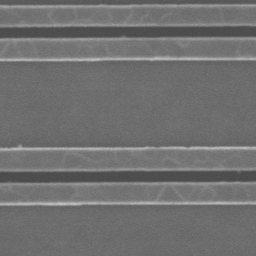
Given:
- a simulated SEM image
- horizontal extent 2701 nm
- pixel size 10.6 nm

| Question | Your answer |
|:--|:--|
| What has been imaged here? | lines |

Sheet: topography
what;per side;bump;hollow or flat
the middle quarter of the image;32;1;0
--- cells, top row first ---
00000000000000000000000000000000
00000000000000000000000000000000
00000000000000000000000000000000
00000000000000000000000000000000
00000000000000000000000000000000
00000000000000000000000000000000
00000000000000000000000000000000
00000000000000000000000000000000
00000000000000000000000000000000
00000000000000000000000000000000
00000000000000000000000000000000
00000000000000000000000000000000
00000000000000000000000000000000
00000000000000000000000000000000
00000000000000000000000000000000
00000000000000000000000000000000
00000000000000000000000000000000
00000000000000000000000000000000
00000000000000000000000000000000
00000000000000000000000000000000
00000000000000000000000000000000
11111111111111111111111111111111
11111111111111111111111111111111
11111111111111111111111111111111
11111111111111111111111111111111
11111111111111111111111111111111
11111111111111111111111111111111
00000000000000000000000000000000
00000000000000000000000000000000
00000000000000000000000000000000
11111111111111111111111111111111
11111111111111111111111111111111